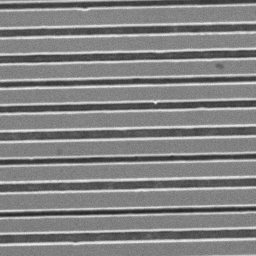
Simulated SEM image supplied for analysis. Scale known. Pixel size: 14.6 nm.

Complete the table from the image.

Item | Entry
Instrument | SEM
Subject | parallel lines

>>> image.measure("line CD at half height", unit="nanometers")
258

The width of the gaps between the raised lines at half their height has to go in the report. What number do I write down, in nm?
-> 129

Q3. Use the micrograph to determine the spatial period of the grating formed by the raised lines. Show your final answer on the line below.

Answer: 375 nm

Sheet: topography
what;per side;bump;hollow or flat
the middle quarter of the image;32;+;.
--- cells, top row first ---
++++++++++++++++++++++++++++++++
++++++++++++++++++++++++++++++++
++++++++++++++++++++++++++++++++
++++++++++......................
................................
..........+..+...+++++++++++++++
++++++++++++++++++++++++++++++++
++++++++++++++++++++++++++++++++
++++++++++++++++++++++++++++++++
++++++++++++++++++....++........
................................
...........................+++++
++++++++++++++++++++++++++++++++
++++++++++++++++++++++++++++++++
++++++++++++++++++++++++++++++++
++++++++++++++++++++++++++++++++
................................
................................
................................
++++++++++++++++++++++++++++++++
++++++++++++++++++++++++++++++++
++++++++++++++++++++++++++++++++
++++++++++++++++++++++++++++++++
................................
...........................+++.+
++++++++++++++++++++++++++++++++
++++++++++++++++++++++++++++++++
++++++++++++++++++++++++++++++++
+++++++++++++++++++++++++++++...
................................
................................
..................+++.....++++++